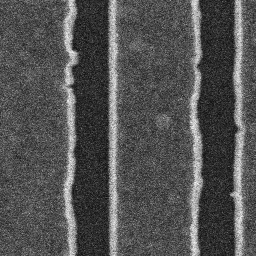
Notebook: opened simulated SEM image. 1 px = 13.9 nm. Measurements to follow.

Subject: one or a few lines or trenches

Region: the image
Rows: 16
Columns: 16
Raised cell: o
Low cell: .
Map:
ooooo..ooooo...o
oooo...ooooo...o
oooo...ooooo...o
ooooo..ooooo...o
oooo...ooooo...o
oooo...ooooo...o
oooo...ooooo...o
oooo...ooooo...o
ooooo..ooooo...o
oooo...ooooo...o
ooooo..ooooo...o
oooo...ooooo...o
oooo...ooooo...o
oooo...ooooo...o
ooooo..ooooo...o
ooooo..ooooo...o